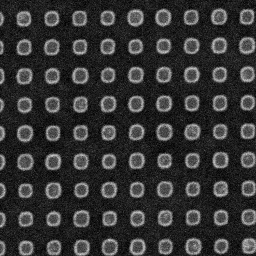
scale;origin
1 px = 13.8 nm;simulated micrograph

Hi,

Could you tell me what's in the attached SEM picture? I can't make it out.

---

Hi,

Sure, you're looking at a regular array of raised bodies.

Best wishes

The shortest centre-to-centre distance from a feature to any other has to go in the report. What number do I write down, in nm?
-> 386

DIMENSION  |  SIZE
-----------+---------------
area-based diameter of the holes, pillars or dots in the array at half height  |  14.7 px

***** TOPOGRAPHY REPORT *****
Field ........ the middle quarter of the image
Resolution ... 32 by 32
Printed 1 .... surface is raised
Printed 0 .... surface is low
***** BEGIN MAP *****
00000000000000000000000000000000
00011000001100000110000011000001
00111100001110001111000111100011
00111100001100001111000111100011
00011000000000000000000000000000
00000000000000000000000000000000
00000000000000000000000000000000
00000000000000000000000000000000
00000000001100000110000011000001
00111100011110001111000111100011
00011100011110001111000111100011
00011000001100000110000011000001
00000000000000000000000000000000
00000000000000000000000000000000
00000000000000000000000000000000
00000000000100000110000011000001
00011100001110000111000111100011
00011100001110000111000111100011
00011000001100000110000011000001
00000000000000000000000000000000
00000000000000000000000000000000
00000000000000000000000000000000
00000000000000000000000000000000
00011100001110000111000011100001
00011100001110000111000011100001
00011100001100000111000011000001
00000000000000000000000000000000
00000000000000000000000000000000
00000000000000000000000000000000
00000000000000000000000001000000
00011100001110000111000011100001
00011100001110000111000011100001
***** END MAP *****